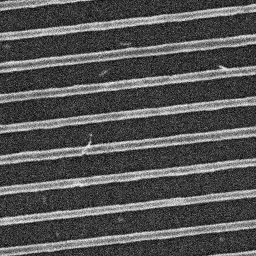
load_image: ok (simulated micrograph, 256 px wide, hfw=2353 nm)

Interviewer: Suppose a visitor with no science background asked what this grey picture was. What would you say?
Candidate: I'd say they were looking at parallel lines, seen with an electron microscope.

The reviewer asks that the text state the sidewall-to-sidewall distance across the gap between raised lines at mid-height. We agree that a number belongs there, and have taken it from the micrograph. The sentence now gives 211 nanometers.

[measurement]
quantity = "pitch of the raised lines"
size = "281 nanometres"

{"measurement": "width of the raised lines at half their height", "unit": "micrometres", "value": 0.0707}